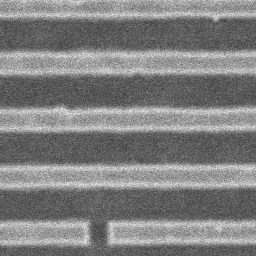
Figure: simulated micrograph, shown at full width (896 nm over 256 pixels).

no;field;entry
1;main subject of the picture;parallel lines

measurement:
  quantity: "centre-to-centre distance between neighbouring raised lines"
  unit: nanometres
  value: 198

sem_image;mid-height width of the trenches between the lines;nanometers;122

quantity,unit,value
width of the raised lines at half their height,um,0.077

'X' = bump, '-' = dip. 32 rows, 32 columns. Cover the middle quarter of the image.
XXXXXXXXXXXXXXXXXXXXXXXXXXXXXXXX
XXXXXXXXXXXXXXXXXXXXXXXXXXXXXXXX
--------XXXXX-------------------
--------------------------------
--------------------------------
--------------------------------
--------------------------------
--------------------------------
--------------------------------
--------------------------------
--------------------------------
X----XXXXXXXXXXXXXXXXXXXXXXXXXXX
XXXXXXXXXXXXXXXXXXXXXXXXXXXXXXXX
XXXXXXXXXXXXXXXXXXXXXXXXXXXXXXXX
XXXXXXXXXXXXXXXXXXXXXXXXXXXXXXXX
XXXXXXXXXXXXXXXXXXXXXXXXXXXXXXXX
XXXXXXXXXXXXXXXXXXXXXX-------XXX
--------------------------------
--------------------------------
--------------------------------
--------------------------------
--------------------------------
--------------------------------
--------------------------------
--------------------------------
--------X----XXXXXXXXXXXXXXXXXXX
XXXXXXXXXXXXXXXXXXXXXXXXXXXXXXXX
XXXXXXXXXXXXXXXXXXXXXXXXXXXXXXXX
XXXXXXXXXXXXXXXXXXXXXXXXXXXXXXXX
XXXXXXXXXXXXXXXXXXXXXXXXXXXXXXXX
XXXXXXXXXXXXXXXXXXXXXXXXXXXXXXXX
--------------------------------